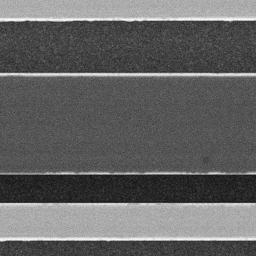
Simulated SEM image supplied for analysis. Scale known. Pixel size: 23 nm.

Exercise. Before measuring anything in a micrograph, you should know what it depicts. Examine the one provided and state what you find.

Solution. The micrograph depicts lines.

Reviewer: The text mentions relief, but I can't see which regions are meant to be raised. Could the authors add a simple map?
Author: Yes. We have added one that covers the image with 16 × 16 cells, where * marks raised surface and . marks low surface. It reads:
****************
................
................
................
................
****************
****************
****************
****************
****************
****************
................
................
****************
****************
................